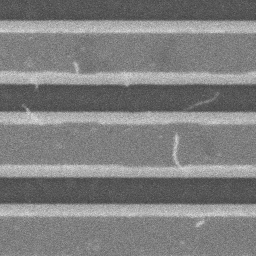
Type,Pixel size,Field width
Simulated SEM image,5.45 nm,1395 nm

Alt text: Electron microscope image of one or a few lines or trenches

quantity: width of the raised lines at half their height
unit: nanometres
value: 302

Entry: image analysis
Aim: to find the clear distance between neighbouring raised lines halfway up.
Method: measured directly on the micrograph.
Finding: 198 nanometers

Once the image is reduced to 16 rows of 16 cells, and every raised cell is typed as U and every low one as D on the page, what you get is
DDDDDDDDDDDDDDDD
DDDDDDDDDDDDDDDD
UUUUUUUUUUUUUUUU
UUUUUUUUUUUUUUUU
UUUUUUUUUUUUUUUU
DDDDDDDDDDDDDDDD
DDDDDDDDDDDDDDDD
UUUUUUUUUUUUUUUU
UUUUUUUUUUUUUUUU
UUUUUUUUUUUUUUUU
UUUUUUUUUUUUUUUU
DDDDDDDDDDDDDDDD
DDDDDDDDDDDDDDDD
UUUUUUUUUUUUUUUU
UUUUUUUUUUUUUUUU
UUUUUUUUUUUUUUUU